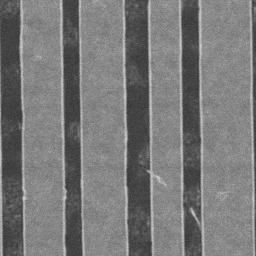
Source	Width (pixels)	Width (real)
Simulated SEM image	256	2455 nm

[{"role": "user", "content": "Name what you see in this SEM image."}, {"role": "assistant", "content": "one or a few lines or trenches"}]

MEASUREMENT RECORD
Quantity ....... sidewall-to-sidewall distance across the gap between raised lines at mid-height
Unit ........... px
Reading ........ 20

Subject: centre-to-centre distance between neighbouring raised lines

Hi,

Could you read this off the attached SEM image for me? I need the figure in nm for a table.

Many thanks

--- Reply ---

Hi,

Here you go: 589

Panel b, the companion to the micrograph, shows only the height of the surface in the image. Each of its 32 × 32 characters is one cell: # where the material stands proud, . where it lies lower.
...#####..#####....###...######.
...#####..#####....###...######.
...#####..#####....###...######.
...#####..#####....####..######.
...#####..#####....####..######.
...#####..#####....####..######.
...#####..#####....####..######.
...#####..#####....###...######.
...#####..#####....###...######.
...#####..#####....####..######.
...#####..#####....####..######.
...#####..######...####..######.
...#####..######...####..######.
...#####..######...####..######.
...#####..######...####..######.
...#####..######...####..######.
...#####..######...####..#######
...#####..######...####..#######
...#####..######...####..#######
...#####..######...####..#######
...#####..######...####..#######
...#####..######...####..#######
...#####..######...####..#######
...#####..######...####..#######
...#####..######...####.########
...#####..######...####..#######
...#####..######...####..#######
...#####..######...####..#######
...#####..######...####..#######
...#####..######...####..#######
...#####..######...####..#######
...#####..######...####...######